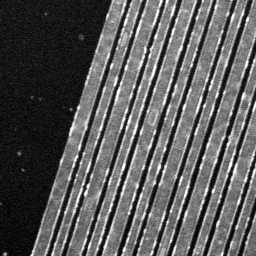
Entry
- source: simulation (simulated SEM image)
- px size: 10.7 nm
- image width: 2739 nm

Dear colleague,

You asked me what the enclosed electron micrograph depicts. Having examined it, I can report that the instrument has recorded parallel lines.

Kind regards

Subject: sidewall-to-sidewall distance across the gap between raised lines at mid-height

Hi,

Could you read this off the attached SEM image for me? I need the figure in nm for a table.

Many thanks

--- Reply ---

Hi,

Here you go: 122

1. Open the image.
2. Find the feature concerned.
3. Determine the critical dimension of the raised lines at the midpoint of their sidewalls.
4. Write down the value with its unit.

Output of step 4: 0.0727 µm